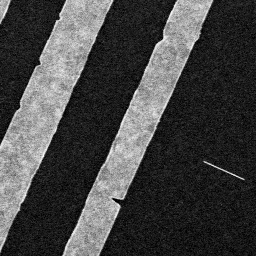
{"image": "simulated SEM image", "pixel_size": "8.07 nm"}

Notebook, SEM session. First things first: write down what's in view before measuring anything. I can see one or a few lines or trenches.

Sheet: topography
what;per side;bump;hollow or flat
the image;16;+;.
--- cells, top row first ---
....+++....++...
....++....+++...
...+++....++....
...++.....++....
..+++....++.....
..+++....++.....
.+++....++......
.+++....++......
+++....++.......
+++....++.......
++....+++.......
++....++........
+....++.........
+....++.........
.....++.........
....++..........